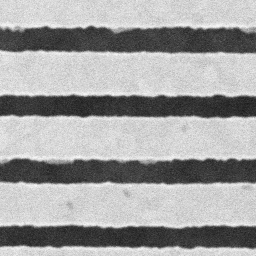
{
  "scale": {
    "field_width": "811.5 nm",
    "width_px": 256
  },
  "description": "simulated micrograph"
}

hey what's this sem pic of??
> lines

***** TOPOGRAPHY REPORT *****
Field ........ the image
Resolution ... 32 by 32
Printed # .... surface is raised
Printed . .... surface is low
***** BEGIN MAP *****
################################
################################
################################
..............#.................
................................
................................
#.######.###.#...#..............
################################
################################
################################
################################
################################
................................
................................
.#..#...........................
################################
################################
################################
################################
################################
................................
................................
................................
################################
################################
################################
################################
################################
................................
................................
................................
################################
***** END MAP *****